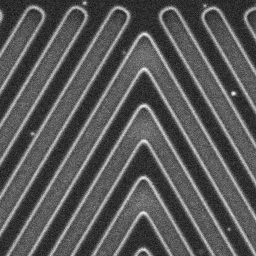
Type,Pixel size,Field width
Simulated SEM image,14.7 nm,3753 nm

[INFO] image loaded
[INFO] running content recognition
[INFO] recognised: groups of lines, slits or small figures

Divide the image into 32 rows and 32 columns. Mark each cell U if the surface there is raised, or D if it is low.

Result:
UUUUUUUUUUUUUUUUUUUUUUUUUUUUUUUU
UUUDDUUUUDUUUUDDUUUUUDUUUUDUUUUD
UUUDDUUUDDDUUDDDUUUUDDDUUUDDUUUD
UUDDDUUDDDUUUDDUUUUUUDDUUUDDDUUD
UUDDUUUDDUUUDDDUUUUUUDDDUUUDDUUU
UDDUUUDDDUUUDDUUUDDUUUDDUUUDDDUU
DDDUUUDDUUUDDDUUDDDDUUUDDUUUDDUU
DDUUUDDDUUDDDUUUDDDDUUUDDDUUDDDU
DDUUDDDUUUDDUUUDDDDDDUUUDDUUUDDD
DUUUDDUUUDDDUUUDDUUDDUUUDDDUUUDD
DUUDDDUUUDDUUUDDDUUUDDUUUDDUUUDD
UUUDDUUUDDDUUDDDUUUUDDDUUDDDUUUD
UUDDDUUDDDUUUDDUUUUUUDDUUUDDDUUD
UDDDUUUDDUUUDDDUUUUUUDDDUUUDDUUU
UDDUUUDDDUUUDDUUUDDUUUDDUUUDDDUU
DDDUUUDDUUUDDDUUDDDDUUDDDUUUDDUU
DDUUUDDDUUDDDUUUDDDDUUUDDDUUDDDU
DDUUDDDUUUDDUUUDDDDDDUUUDDUUUDDU
DUUUDDUUUDDDUUUDDUUDDUUUDDDUUUDD
UUUDDDUUUDDUUUDDUUUDDDUUUDDUUUDD
UUUDDUUUDDUUUDDDUUUUDDDUUDDDUUUD
UUDDUUUDDDUUUDDUUUUUUDDUUUDDDUUD
UDDDUUUDDUUUDDDUUUUUUDDDUUUDDUUU
UDDUUUDDDUUDDDUUUDDUUUDDUUUDDDUU
DDDUUDDDUUUDDUUUDDDDUUDDDUUUDDUU
DDUUUDDUUUDDDUUUDDDDUUUDDDUUDDDU
DDUUDDDUUUDDUUUDDDDDDUUUDDUUUDDU
DUUUDDUUUDDDUUDDDUUDDUUUDDDUUUDD
UUUDDDUUDDDUUUDDUUUDDDUUUDDUUUDD
UUDDDUUUDDUUUDDDUUUUDDDUUDDDUUUD
UUDDUUUDDDUUUDDUUUUUUDDUUUDDUUUD
UDDDUUUDDUUUDDDUUUUUUDDDUUUDDUUU